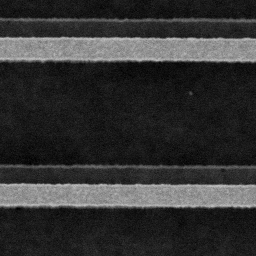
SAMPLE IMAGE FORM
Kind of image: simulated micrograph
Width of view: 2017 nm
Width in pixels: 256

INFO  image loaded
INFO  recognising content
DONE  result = lines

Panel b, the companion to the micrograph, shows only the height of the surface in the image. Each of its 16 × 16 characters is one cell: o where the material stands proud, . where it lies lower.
................
oooooooooooooooo
oooooooooooooooo
oooooooooooooooo
................
................
................
................
................
................
oooooooooooooooo
oooooooooooooooo
oooooooooooooooo
................
................
................